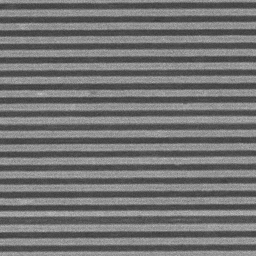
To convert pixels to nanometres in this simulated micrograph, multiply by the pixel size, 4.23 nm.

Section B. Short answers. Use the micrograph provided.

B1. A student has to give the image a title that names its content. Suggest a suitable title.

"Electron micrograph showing parallel lines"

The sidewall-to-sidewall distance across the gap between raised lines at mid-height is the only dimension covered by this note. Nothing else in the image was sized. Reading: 27.5 nm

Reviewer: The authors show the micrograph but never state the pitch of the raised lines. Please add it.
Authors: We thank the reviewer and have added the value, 0.0569 microns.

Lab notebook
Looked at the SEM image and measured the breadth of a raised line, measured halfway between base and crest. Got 28 nm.